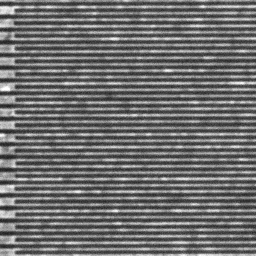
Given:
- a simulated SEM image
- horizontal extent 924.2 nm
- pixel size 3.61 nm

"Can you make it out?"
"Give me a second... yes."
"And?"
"parallel lines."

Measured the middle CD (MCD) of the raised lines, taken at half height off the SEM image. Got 5 nanometers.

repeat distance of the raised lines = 23 nm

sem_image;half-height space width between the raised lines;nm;18.5